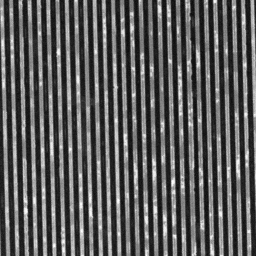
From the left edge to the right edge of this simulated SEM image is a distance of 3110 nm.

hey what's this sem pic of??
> parallel lines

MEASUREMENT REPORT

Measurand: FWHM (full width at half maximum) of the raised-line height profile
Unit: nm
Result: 45.5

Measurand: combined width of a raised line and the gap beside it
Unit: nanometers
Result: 113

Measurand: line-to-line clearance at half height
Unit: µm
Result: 0.0683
